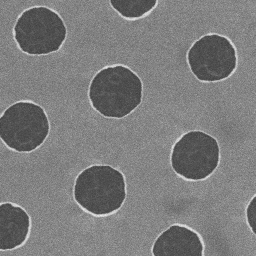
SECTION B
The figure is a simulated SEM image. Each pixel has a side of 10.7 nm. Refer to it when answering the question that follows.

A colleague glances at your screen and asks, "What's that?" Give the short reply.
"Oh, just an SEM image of holes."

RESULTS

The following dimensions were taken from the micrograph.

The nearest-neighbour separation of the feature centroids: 99.1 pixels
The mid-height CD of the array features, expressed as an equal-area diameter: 530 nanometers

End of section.